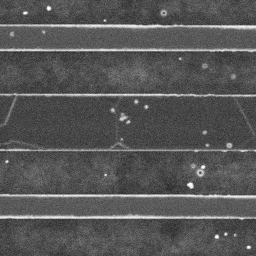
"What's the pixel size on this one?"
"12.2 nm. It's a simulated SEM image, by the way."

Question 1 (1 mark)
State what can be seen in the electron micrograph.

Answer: lines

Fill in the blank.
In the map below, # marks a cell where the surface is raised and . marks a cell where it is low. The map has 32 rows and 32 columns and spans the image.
................................
................................
................................
################################
################################
################################
................................
................................
................................
................................
................................
................................
################################
################################
################################
################################
################################
################################
################################
................................
................................
................................
................................
................................
#######################.........
################################
################################
................................
................................
................................
................................
................................